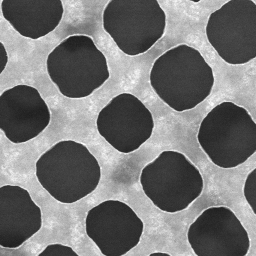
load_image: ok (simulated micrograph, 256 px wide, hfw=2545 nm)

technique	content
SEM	holes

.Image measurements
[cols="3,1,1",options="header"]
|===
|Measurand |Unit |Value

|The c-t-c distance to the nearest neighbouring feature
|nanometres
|734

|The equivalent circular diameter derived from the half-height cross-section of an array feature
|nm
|596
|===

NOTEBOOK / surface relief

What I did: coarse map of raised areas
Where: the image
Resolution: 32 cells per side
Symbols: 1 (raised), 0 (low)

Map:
00000000111111000000111111110000
00000000111110000000111111100000
10000000111110000000011111000000
11000001111110000000111111000000
11100111100111000000111111000000
11111110000011100001111111000000
01111100000001100011100001100000
01111100000001111111000000110001
01111100000001111110000000111111
11111100000000111110000000011111
11111110000001111110000000011111
10000111000111111110000000111111
00000111111111000111000001111111
00000011111110000011100011100011
00000011111100000001111111000001
00000011111100000001111110000000
00000111111100000001111110000000
10001111111110000011111110000000
11111100000111000111111110000000
11111000000011111111000111000001
11111000000011111110000011100011
11111000000001111100000001111110
11111000000011111100000001111110
00011100000011111100000001111110
00001110000111111100000001111110
00001111111100001110000011111110
00000111111000000111101110000111
00000111111000000011111100000011
00000111111000000011111100000011
00001111111000000011111000000001
00011111111100000111111100000001
11111000011110001111111100000001